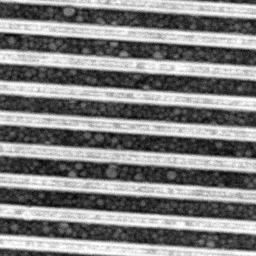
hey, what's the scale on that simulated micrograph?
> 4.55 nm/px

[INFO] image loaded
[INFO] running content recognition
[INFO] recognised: parallel lines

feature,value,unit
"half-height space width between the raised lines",0.0999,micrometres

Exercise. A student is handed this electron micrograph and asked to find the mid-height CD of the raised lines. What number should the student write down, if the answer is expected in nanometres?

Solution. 41.4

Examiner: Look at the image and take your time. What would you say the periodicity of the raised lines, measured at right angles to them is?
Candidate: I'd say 140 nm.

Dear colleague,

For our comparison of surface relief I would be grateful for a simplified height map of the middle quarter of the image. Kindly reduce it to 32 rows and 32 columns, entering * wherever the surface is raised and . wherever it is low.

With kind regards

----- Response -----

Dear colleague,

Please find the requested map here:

...*****************************
..................**************
................................
................................
................................
................................
*******.........................
**************************......
..........**********************
........................********
................................
................................
................................
................................
**************..................
*****************************...
.............*******************
............................****
................................
................................
................................
***.*...........................
*********************...........
.*******************************
................****************
...............................*
................................
................................
................................
*********.......................
************************........
.......*************************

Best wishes